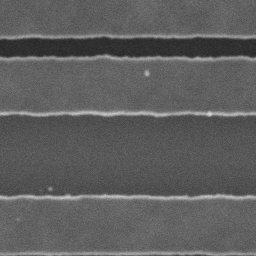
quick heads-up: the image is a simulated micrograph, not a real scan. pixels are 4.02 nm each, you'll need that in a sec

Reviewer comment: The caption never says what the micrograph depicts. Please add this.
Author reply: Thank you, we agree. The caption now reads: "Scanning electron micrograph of lines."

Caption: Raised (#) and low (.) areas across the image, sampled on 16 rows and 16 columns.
################
################
................
......#.........
################
################
################
................
................
................
................
................
################
################
################
################